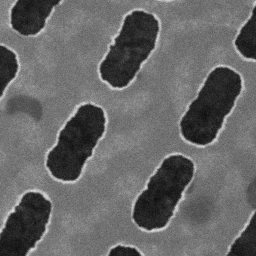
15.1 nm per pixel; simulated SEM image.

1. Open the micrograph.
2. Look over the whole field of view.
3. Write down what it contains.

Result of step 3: holes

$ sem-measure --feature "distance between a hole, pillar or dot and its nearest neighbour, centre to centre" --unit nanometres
1490